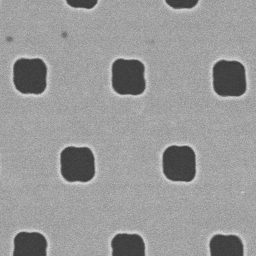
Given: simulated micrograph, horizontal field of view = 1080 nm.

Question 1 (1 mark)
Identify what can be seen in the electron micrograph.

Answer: holes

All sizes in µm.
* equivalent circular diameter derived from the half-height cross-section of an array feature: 0.157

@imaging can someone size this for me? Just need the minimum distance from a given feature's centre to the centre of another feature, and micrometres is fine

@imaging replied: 0.415